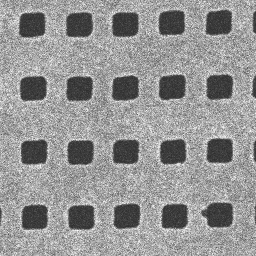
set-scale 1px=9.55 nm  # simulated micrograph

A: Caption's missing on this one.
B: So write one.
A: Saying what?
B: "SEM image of a regular array of holes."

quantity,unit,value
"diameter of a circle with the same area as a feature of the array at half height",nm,266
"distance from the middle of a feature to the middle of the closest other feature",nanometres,440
